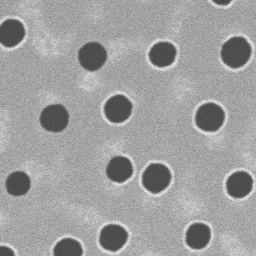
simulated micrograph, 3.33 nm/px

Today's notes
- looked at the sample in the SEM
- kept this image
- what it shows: a regular array of holes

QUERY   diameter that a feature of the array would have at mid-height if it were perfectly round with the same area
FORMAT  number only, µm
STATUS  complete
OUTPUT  0.0936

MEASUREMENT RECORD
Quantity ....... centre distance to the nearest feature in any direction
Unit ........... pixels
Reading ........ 66.1